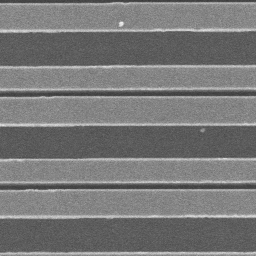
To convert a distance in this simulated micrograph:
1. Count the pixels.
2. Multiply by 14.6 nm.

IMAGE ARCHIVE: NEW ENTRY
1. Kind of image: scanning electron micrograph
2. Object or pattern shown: lines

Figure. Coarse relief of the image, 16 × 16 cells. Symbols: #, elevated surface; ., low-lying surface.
################
################
................
................
################
################
################
################
................
................
################
################
################
################
................
................